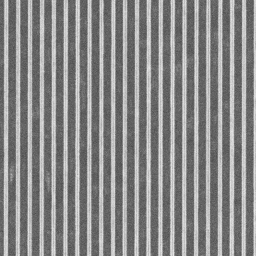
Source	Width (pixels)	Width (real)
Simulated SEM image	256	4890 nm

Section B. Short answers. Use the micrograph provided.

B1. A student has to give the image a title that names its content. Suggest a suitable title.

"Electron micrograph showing parallel lines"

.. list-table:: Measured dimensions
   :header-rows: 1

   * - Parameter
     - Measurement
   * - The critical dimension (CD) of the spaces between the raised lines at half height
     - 177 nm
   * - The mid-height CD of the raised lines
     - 52.5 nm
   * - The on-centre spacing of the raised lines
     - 228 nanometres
